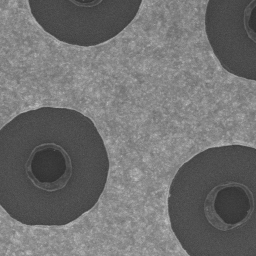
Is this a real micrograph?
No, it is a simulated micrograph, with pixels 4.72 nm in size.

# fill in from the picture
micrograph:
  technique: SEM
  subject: ring-shaped grooves with a dot in the middle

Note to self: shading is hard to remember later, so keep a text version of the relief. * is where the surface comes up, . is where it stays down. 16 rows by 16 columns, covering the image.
**.......****...
**......*****...
****...******...
*************...
**************..
****************
****************
*.....**********
......**********
.......******...
.......****.....
...*...****.....
......****......
*....******..*..
***********.....
***********.....